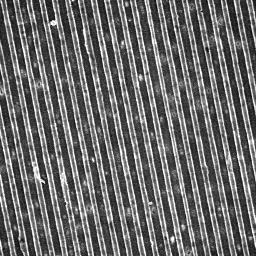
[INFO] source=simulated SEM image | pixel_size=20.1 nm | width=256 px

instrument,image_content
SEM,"parallel lines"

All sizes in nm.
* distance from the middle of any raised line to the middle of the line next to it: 256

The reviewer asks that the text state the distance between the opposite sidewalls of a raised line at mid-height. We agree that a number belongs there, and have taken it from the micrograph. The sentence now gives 89 nanometers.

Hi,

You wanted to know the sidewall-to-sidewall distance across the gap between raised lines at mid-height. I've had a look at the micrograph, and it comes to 0.161 um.